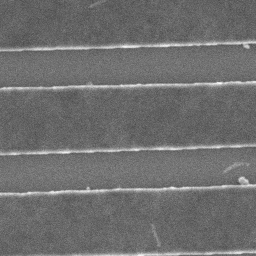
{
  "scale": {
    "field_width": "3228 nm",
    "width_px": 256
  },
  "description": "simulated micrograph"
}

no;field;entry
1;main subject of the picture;lines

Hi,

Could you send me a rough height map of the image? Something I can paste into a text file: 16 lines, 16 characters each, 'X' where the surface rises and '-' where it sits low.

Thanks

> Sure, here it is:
XXXXXXXXXXXXXXXX
XXXXXXXXXXXXXXXX
XXXXXXXXXXXXXXXX
----------------
----------------
XXXXXXXXXXXXXXXX
XXXXXXXXXXXXXXXX
XXXXXXXXXXXXXXXX
XXXXXXXXXXXXXXXX
XXXXX-----------
----------------
----------------
XXXXXXXXXXXXXXXX
XXXXXXXXXXXXXXXX
XXXXXXXXXXXXXXXX
XXXXXXXXXXXXXXXX